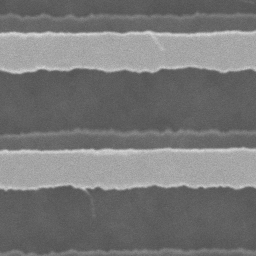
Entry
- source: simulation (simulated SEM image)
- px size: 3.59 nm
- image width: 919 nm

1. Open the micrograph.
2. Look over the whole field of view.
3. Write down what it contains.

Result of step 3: lines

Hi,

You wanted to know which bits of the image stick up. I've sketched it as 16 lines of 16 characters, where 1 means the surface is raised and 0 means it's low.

0000000000000000
0000000000000000
1111111111111111
1111111111111111
0100000000000000
0000000000000000
0000000000000000
0000000000000000
0000000000000000
1111111111111111
1111111111111111
1111111111111111
0000000000000000
0000000000000000
0000000000000000
0000000000000000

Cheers